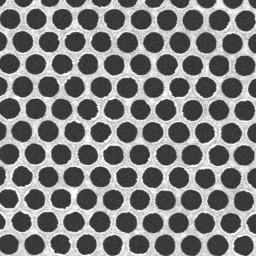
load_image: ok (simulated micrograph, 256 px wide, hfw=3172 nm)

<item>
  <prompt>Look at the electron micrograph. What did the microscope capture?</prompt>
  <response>a regular array of holes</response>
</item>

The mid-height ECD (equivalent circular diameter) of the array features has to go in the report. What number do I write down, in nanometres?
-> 260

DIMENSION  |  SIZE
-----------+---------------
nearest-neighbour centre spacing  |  318 nanometres